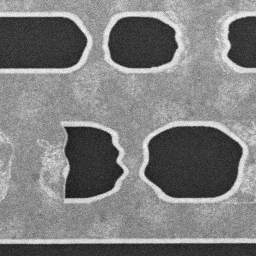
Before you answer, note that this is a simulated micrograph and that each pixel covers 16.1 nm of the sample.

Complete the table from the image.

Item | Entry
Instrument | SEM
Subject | one or a few lines or trenches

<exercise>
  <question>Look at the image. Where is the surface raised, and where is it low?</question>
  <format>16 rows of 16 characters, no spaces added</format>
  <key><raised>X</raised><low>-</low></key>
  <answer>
XXXXXXXXXXXXXXXX
-----XX----XXX--
------X----XXX--
-----XX----XXX--
XXXXXXXXXXXXXXXX
XXXXXXXXXXXXXXXX
XXXXXXXXXXXXXXXX
XXXXXXXXXXXXXXXX
XXXX---XXX-----X
XXXX---XX------X
XXXX----X------X
XXXX---XX------X
XXXX--XXXXX--XXX
XXXXXXXXXXXXXXXX
XXXXXXXXXXXXXXXX
----------------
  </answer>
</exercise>